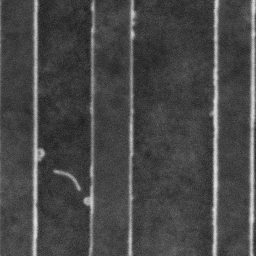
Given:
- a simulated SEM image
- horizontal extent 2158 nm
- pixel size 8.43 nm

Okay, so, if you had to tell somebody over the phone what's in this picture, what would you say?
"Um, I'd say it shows lines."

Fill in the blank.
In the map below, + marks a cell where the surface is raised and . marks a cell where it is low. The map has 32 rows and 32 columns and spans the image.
+++++.......+++++..........+++++
+++++.......+++++..........+++++
+++++.......++++...........+++++
+++++.......+++++..........+++++
+++++.......+++++..........+++++
+++++.......++++...........+++++
+++++.......++++...........+++++
+++++.......++++...........+++++
+++++.......++++...........+++++
+++++.......++++...........+++++
+++++.......++++...........+++++
+++++.......++++...........+++++
+++++......+++++...........+++++
+++++......+++++...........+++++
+++++.......++++...........+++++
+++++.......++++...........+++++
+++++.......++++...........+++++
+++++.......++++...........+++++
+++++.......++++...........+++++
+++++.......++++...........+++++
+++++......+++++...........+++++
+++++......+++++...........+++++
++++.......+++++...........+++++
++++.......+++++...........+++++
++++.......+++++...........+++++
++++.......+++++...........++++.
++++.......+++++...........++++.
++++.......+++++...........++++.
++++.......+++++...........++++.
++++.......+++++...........++++.
++++.......+++++...........++++.
++++.......+++++...........++++.